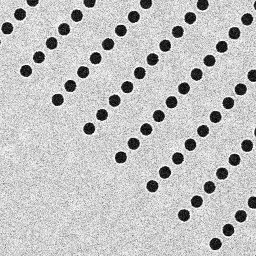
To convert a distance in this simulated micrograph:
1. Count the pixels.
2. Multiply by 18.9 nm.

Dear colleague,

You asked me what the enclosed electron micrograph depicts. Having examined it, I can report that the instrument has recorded a regular array of holes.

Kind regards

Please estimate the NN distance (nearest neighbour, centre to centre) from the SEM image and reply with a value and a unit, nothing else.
352 nanometres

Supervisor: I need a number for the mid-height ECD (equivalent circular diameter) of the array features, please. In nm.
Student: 235